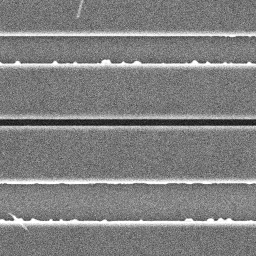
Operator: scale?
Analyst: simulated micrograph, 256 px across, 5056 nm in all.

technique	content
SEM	lines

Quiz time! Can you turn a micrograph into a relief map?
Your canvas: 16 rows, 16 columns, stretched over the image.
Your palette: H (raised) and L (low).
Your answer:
HHHHHHHHHHHHHHHH
HHHHHHHHHHHHHHHH
LLLLLLLLLLLLLLLL
LLLLLLLLLLLLLLLL
HHHHHHHHHHHHHHHH
HHHHHHHHHHHHHHHH
HHHHHHHHHHHHHHHH
HHHHHHHHHHHHHHHH
HHHHHHHHHHHHHHHH
HHHHHHHHHHHHHHHH
HHHHHHHHHHHHHHHH
LLLLLLLLLLLLLLLL
LLLLLLLLLLLLLLLL
LLLLLLLLLLLLLLLL
HHHHHHHHHHHHHHHH
HHHHHHHHHHHHHHHH